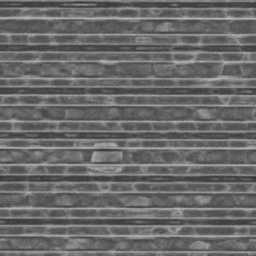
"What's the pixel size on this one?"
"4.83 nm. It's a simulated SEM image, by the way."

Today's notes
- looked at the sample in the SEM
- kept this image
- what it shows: parallel lines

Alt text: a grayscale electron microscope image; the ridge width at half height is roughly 50.7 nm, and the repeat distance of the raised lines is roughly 105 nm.